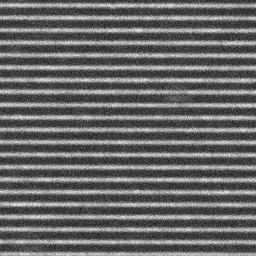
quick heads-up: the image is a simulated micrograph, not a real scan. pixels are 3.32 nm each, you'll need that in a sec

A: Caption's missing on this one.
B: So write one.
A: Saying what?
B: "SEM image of parallel lines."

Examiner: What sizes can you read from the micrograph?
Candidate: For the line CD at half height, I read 9.1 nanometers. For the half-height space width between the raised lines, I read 32.7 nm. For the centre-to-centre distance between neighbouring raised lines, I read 41.3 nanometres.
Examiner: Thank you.